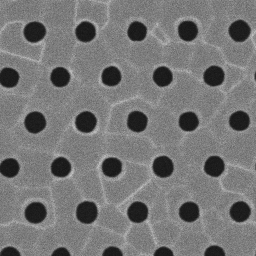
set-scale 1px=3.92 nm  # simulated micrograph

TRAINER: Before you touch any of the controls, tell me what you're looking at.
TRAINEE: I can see a regular array of holes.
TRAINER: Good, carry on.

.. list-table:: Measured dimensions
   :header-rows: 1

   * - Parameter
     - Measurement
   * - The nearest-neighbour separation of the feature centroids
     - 200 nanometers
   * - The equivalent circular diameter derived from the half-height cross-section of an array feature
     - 77.3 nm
